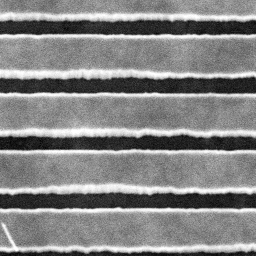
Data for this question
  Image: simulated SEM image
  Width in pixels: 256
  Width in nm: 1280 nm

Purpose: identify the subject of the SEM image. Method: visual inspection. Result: lines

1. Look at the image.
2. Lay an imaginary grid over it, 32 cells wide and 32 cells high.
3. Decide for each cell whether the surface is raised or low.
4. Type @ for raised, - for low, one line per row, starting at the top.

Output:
@@@@@@@@@@@@@@@@@@@@@@@@@@@@@@@@
@@@@@@@@@@@@@@@@@@@@@@@@@@@@@@@@
--------------------------------
--------------------------------
@@@@@@@@@@@@@@@@@@@@@@@@@@@@@@@@
@@@@@@@@@@@@@@@@@@@@@@@@@@@@@@@@
@@@@@@@@@@@@@@@@@@@@@@@@@@@@@@@@
@@@@@@@@@@@@@@@@@@@@@@@@@@@@@@@@
@@@@@@@@@@@@@@@@@@@@@@@@@@@@@@@@
--@@@@@@@-@@@@---@@@@@@@@@@@@@@@
--------------------------------
--------------------------------
@@@@@@@@@@@@@@@@@@@@@@@@@@@@@@@@
@@@@@@@@@@@@@@@@@@@@@@@@@@@@@@@@
@@@@@@@@@@@@@@@@@@@@@@@@@@@@@@@@
@@@@@@@@@@@@@@@@@@@@@@@@@@@@@@@@
@@@@@@@@@@@@@@@@@@@@@@@@@@@@@@@@
--------------------------------
--------------------------------
@@@@@@@@@@@@@@@@@@@@@@@@@@@@@@@@
@@@@@@@@@@@@@@@@@@@@@@@@@@@@@@@@
@@@@@@@@@@@@@@@@@@@@@@@@@@@@@@@@
@@@@@@@@@@@@@@@@@@@@@@@@@@@@@@@@
@@@@@@@@@@@@@@@@@@@@@@@@@@@@@@@@
--------------------------------
--------------------------------
@@@@@@@@@@@@@@@@@@@@@@@@@@@@@@@@
@@@@@@@@@@@@@@@@@@@@@@@@@@@@@@@@
@@@@@@@@@@@@@@@@@@@@@@@@@@@@@@@@
@@@@@@@@@@@@@@@@@@@@@@@@@@@@@@@@
@@@@@@@@@@@@@@@@@@@@@@@@@@@@@@@@
--------------------------------